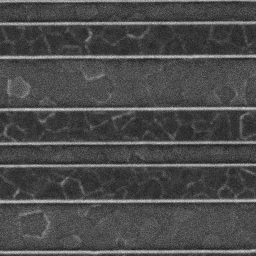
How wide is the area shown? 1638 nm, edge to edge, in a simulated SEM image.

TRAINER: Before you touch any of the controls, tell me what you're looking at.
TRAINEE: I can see one or a few lines or trenches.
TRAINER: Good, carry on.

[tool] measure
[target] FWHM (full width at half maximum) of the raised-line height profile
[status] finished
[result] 217 nm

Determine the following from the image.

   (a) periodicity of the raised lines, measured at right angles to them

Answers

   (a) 459 nm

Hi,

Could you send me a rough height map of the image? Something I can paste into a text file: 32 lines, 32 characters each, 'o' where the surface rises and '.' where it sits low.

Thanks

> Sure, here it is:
................................
................................
................................
oooooooooooooooooooooooooooooooo
oooooooooooooooooooooooooooooooo
oooooooooooooooooooooooooooooooo
oooooooooooooooooooooooooooooooo
................................
................................
................................
................................
................................
................................
................................
oooooooooooooooooooooooooooooooo
oooooooooooooooooooooooooooooooo
oooooooooooooooooooooooooooooooo
oooooooooooooooooooooooooooooooo
................................
................................
................................
oooooooooooooooooooooooooooooooo
oooooooooooooooooooooooooooooooo
oooooooooooooooooooooooooooooooo
oooooooooooooooooooooooooooooooo
................................
................................
................................
................................
................................
................................
...........................ooooo